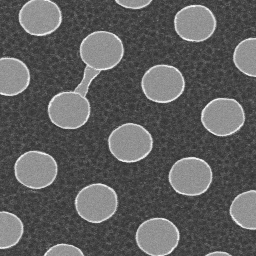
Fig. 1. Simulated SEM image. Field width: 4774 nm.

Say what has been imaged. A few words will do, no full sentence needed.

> raised bodies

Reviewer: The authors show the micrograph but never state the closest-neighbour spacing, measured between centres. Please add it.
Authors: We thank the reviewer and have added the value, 1.26 um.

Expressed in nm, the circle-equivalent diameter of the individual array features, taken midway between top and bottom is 744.